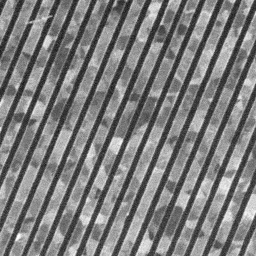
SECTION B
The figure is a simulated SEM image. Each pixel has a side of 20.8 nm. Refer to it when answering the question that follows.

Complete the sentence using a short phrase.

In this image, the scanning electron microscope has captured parallel lines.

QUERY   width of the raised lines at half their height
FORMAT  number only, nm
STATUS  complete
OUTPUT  209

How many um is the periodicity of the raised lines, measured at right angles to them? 0.347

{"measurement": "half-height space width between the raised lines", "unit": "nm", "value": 142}